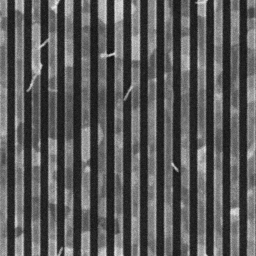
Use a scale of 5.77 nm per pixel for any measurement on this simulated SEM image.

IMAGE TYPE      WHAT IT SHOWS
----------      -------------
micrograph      parallel lines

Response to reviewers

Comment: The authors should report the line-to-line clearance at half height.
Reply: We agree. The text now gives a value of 51.9 nanometres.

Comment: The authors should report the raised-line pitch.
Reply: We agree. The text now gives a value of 16.5 pixels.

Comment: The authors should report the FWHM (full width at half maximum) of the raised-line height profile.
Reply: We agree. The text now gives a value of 41.8 nm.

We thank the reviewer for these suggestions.